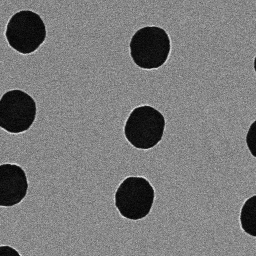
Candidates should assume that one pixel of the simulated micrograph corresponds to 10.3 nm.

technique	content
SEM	holes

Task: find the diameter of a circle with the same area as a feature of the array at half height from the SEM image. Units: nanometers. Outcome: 422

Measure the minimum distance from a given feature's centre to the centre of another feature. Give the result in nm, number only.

778